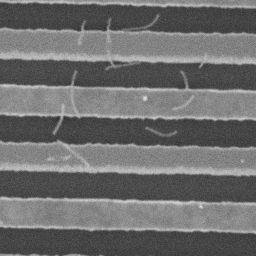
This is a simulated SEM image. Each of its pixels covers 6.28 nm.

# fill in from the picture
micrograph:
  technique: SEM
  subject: lines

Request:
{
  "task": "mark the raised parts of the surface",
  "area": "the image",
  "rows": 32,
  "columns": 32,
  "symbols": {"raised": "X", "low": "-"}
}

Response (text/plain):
------------XX-XXXXXXXXXXXXXXXXX
--------------------------------
--------------------------------
--------------------------------
XXXXXXXXXXXXXXXXXXXXXXXXXXXXXXXX
XXXXXXXXXXXXXXXXXXXXXXXXXXXXXXXX
XXXXXXXXXXXXXXXXXXXXXXXXXXXXXXXX
-------------X----XXXXXXXXXXXXXX
--------------------------------
--------------------------------
--------------------------------
XXXXXXXXXXXXXXXXXXXXXXXXXXXXXXXX
XXXXXXXXXXXXXXXXXXXXXXXXXXXXXXXX
XXXXXXXXXXXXXXXXXXXXXXXXXXXXXXXX
--X--XXXXXXXXXXXXXXXXXXXXXXXXXXX
--------------------------------
--------------------------------
--------------------------------
XXXXXXXXXXXXXXXXXXXXXXXXXXXXXX-X
XXXXXXXXXXXXXXXXXXXXXXXXXXXXXXXX
XXXXXXXXXXXXXXXXXXXXXXXXXXXXXXXX
------------------------X-XXXXXX
--------------------------------
--------------------------------
--------------------------------
XXXXXXXXXXXXXXXXXXXXXXXXXXXXXXXX
XXXXXXXXXXXXXXXXXXXXXXXXXXXXXXXX
XXXXXXXXXXXXXXXXXXXXXXXXXXXXXXXX
-----XXXXXXXXXXXXXXXXXXXXXXXXXXX
--------------------------------
--------------------------------
--------------------------------